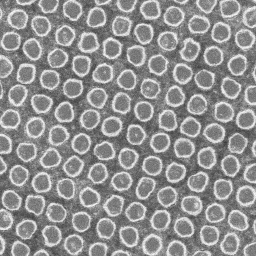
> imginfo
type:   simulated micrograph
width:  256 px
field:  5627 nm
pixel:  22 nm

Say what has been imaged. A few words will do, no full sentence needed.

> a regular array of raised bodies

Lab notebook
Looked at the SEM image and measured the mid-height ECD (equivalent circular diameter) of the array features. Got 406 nanometers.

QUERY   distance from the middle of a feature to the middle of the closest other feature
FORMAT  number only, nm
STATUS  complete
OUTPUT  517